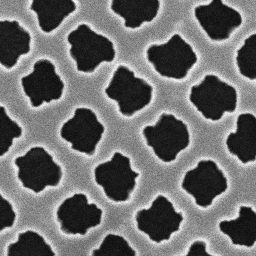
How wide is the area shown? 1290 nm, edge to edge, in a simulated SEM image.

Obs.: a regular array of holes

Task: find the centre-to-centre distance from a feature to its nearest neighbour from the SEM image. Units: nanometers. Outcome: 291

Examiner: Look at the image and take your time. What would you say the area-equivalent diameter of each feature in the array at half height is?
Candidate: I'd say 211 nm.